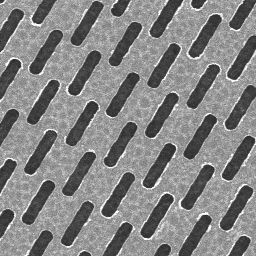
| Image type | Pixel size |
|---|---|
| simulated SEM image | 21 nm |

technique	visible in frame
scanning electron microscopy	a regular array of holes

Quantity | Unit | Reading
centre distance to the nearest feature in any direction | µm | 0.925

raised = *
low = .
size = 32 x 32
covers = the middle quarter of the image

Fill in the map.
****....****.**********....*****
****....**************....******
***....*********..****....******
***...*********....**....*******
**....*********....**...********
*....*********....***...********
*....********....***************
*...*********....*********..****
************....*********....**.
******..****...**********....**.
*****....**....*********....***.
*****....*....*********....*****
****....***...*********....*****
***....***************....******
***....*********.*****...*******
**....*********...***....*******
**...*********....**....********
*....*********....**...*********
....*********....****.**********
....*********...***************.
*..*********....*********...***.
***********....*********....**..
*****...***....*********....**..
****....**....*********....***..
****...***...**********...******
***....****..*********....******
***...***************....*******
**....*********..****....*******
*....*********....**....********
*...**********...***...*********
....*********....***...*********
...*********....***************.